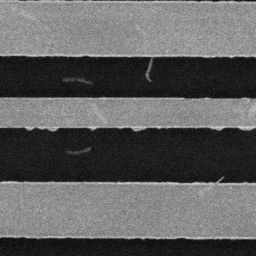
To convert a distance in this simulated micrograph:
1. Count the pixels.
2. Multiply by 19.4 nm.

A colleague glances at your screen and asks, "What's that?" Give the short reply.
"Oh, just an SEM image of lines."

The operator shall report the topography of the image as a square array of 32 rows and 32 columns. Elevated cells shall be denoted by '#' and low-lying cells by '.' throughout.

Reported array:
################################
################################
################################
################################
################################
################################
################################
................................
................................
................................
................................
................................
################################
################################
################################
################################
................................
................................
................................
................................
................................
................................
................................
################################
################################
################################
################################
################################
################################
################################
................................
................................